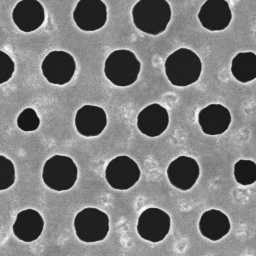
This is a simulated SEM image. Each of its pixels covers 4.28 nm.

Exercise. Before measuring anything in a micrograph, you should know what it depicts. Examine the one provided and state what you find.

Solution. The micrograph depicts a regular array of holes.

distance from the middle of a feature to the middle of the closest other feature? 260 nm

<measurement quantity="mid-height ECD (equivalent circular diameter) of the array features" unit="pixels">33.5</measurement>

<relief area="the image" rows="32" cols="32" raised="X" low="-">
XX---XXXXX---XXXX----XXXX---XXXX
XX---XXXX----XXXX----XXXX----XXX
XX---XXXX----XXXX----XXXX----XXX
XX---XXXXX--XXXXX----XXXXX--XXXX
XXXXXXXXXXXXXXXXXXXXXXXXXXXXXXXX
XXXXXXXXXXXXXXXXXXXXXXXXXXXXXXXX
XXXXXX--XXXXXX--XXXXXX--XXXXXXXX
-XXXXX---XXXX----XXXX----XXXX---
--XXX----XXXX----XXXX----XXXX---
-XXXXX---XXXX----XXXX----XXXX---
XXXXXXX-XXXXXX--XXXXXX--XXXXXXXX
XXXXXXXXXXXXXXXXXXXXXXXXXXXXXXXX
XXXXXXXXXXXXXXXXXXXXXXXXXXXXXXXX
XXXXXXXXXX---XXXXX---XXXXX--XXXX
XX---XXXX----XXXX----XXXX----XXX
XX---XXXX----XXXX----XXXX----XXX
XXXXXXXXXX---XXXXX--XXXXXX--XXXX
XXXXXXXXXXXXXXXXXXXXXXXXXXXXXXXX
XXXXXXXXXXXXXXXXXXXXXXXXXXXXXXXX
XXXXXXX-XXXXXXX-XXXXXXXXXXXXXXXX
--XXXX---XXXXX---XXXX----XXXX---
--XXX-----XXX----XXXX----XXXX---
--XXX-----XXX----XXXX----XXXXX--
-XXXXX---XXXXX--XXXXXX--XXXXXXXX
XXXXXXXXXXXXXXXXXXXXXXXXXXXXXXXX
XXXXXXXXXXXXXXXXXXXXXXXXXXXXXXXX
XXX--XXXXX---XXXXX---XXXXX--XXXX
XX---XXXX-----XXX----XXXX----XXX
XX---XXXX-----XXX----XXXX----XXX
XX---XXXXX---XXXXX---XXXXX--XXXX
XXXXXXXXXXXXXXXXXXXXXXXXXXXXXXXX
XXXXXXXXXXXXXXXXXXXXXXXXXXXXXXXX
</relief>